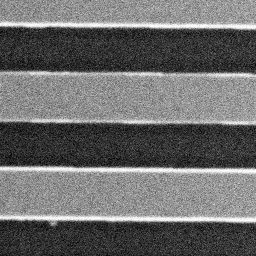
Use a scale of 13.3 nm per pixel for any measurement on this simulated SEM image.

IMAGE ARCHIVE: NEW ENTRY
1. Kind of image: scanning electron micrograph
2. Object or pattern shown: lines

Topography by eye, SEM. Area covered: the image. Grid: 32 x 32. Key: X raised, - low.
XXXXXXXXXXXXXXXXXXXXXXXXXXXXXXXX
XXXXXXXXXXXXXXXXXXXXXXXXXXXXXXXX
XXXXXXXXXXXXXXXXXXXXXXXXXXXXXXXX
--------------------------------
--------------------------------
--------------------------------
--------------------------------
--------------------------------
--------------------------------
XXXXXXXXXXXXXXXXXXXXXXXXXXXXXXXX
XXXXXXXXXXXXXXXXXXXXXXXXXXXXXXXX
XXXXXXXXXXXXXXXXXXXXXXXXXXXXXXXX
XXXXXXXXXXXXXXXXXXXXXXXXXXXXXXXX
XXXXXXXXXXXXXXXXXXXXXXXXXXXXXXXX
XXXXXXXXXXXXXXXXXXXXXXXXXXXXXXXX
--------------------------------
--------------------------------
--------------------------------
--------------------------------
--------------------------------
--------------------------------
XXXXXXXXXXXXXXXXXXXXXXXXXXXXXXXX
XXXXXXXXXXXXXXXXXXXXXXXXXXXXXXXX
XXXXXXXXXXXXXXXXXXXXXXXXXXXXXXXX
XXXXXXXXXXXXXXXXXXXXXXXXXXXXXXXX
XXXXXXXXXXXXXXXXXXXXXXXXXXXXXXXX
XXXXXXXXXXXXXXXXXXXXXXXXXXXXXXXX
---------------------XXXXXXXXXXX
--------------------------------
--------------------------------
--------------------------------
--------------------------------